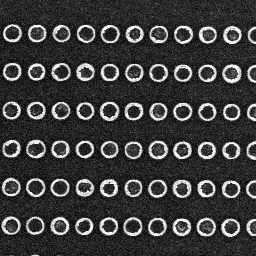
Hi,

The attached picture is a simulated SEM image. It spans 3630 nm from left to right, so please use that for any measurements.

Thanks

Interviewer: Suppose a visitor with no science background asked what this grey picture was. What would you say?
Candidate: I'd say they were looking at a regular array of raised bodies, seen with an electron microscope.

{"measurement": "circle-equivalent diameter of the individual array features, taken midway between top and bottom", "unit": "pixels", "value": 16.8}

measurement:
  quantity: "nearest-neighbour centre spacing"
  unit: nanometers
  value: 345